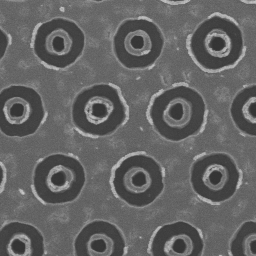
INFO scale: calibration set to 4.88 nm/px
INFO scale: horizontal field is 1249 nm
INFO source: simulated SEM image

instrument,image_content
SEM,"a regular array of ring-shaped grooves with a dot in the middle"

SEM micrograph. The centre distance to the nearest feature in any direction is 380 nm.